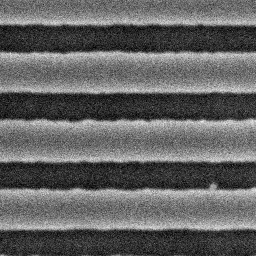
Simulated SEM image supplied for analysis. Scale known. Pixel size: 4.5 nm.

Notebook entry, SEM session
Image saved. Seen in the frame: lines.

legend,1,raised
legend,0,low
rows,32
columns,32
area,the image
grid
11111111111111111111111111111111
11111111111111111111111111111111
11111111111111111111111111111111
00000000000000000000000000000000
00000000000000000000000000000000
00000000000000000000000000000000
00000000000000000000000000000000
11111111111111111111111111111111
11111111111111111111111111111111
11111111111111111111111111111111
11111111111111111111111111111111
10001111111111111111111111111111
00000000000000000000000000000000
00000000000000000000000000000000
00000000000000000000000000000000
11111111111111111111111111111111
11111111111111111111111111111111
11111111111111111111111111111111
11111111111111111111111111111111
11111111111111111111111111111111
00000000000000000000000000000000
00000000000000000000000000000000
00000000000000000000000000000000
00000000000000000000000000100000
11111111111111111111111111111111
11111111111111111111111111111111
11111111111111111111111111111111
11111111111111111111111111111111
11111111111111111111111111111111
00000000000000000000000000000000
00000000000000000000000000000000
00000000000000000000000000000000